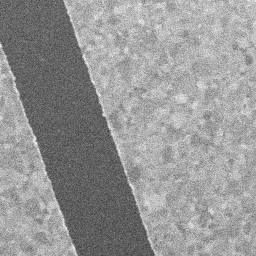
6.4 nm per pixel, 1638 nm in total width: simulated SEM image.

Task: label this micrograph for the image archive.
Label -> one or a few lines or trenches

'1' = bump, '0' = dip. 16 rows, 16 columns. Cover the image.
0000111111111111
0000011111111111
0000011111111111
0000011111111111
1000001111111111
1000001111111111
1000001111111111
1100000111111111
1100000111111111
1100000111111111
1110000011111111
1110000011111111
1110000001111111
1111000001111111
1111000001111111
1111100000111111